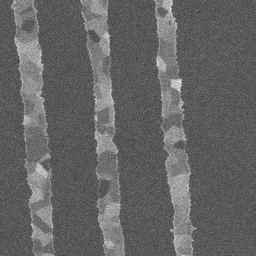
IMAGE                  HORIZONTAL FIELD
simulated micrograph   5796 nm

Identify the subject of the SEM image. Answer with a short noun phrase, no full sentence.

one or a few lines or trenches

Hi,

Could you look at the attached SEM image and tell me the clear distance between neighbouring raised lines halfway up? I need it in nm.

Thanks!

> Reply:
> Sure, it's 1120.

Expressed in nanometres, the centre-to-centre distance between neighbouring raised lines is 1570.